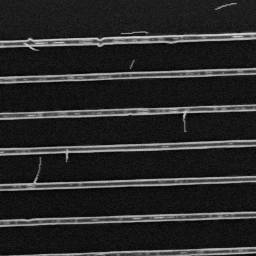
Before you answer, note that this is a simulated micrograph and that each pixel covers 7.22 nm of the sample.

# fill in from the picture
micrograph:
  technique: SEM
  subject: parallel lines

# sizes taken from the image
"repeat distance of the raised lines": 258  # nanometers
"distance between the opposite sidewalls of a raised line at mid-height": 41.5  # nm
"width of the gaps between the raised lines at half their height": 217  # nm